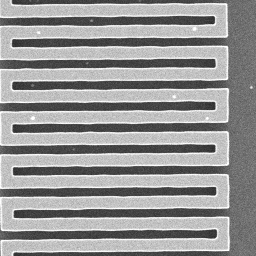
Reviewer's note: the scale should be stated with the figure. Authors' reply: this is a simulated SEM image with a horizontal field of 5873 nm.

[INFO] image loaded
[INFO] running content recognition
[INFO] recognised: groups of lines, slits or small figures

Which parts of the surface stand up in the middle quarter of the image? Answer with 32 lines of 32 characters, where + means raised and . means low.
................................
++++++++++++++++++++++++++++++++
++++++++++++++++++++++++++++++++
++++++++++++++++++++++++++++++++
................................
................................
++..........++++++++++++++++++++
++++++++++++++++++++++++++++++++
++++++++++++++++++++++++++++++++
++++++++++++++++++++............
................................
................................
++++++++++++++++++++++++++++++++
++++++++++++++++++++++++++++++++
++++++++++++++++++++++++++++++++
................................
................................
++++++++++++++++++++++++++++++++
++++++++++++++++++++++++++++++++
++++++++++++++++++++++++++++++++
................................
................................
...........+++.+++++++++++++++++
++++++++++++++++++++++++++++++++
++++++++++++++++++++++++++++++++
+++++++++++++++++...............
................................
................................
++++++++++++++++++++++++++++++++
++++++++++++++++++++++++++++++++
++++++++++++++++++++++++++++++++
................................